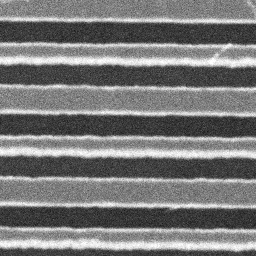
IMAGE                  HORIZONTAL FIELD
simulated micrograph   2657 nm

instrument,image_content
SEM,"lines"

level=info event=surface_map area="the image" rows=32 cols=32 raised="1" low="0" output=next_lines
11111111111111111111111111111111
11111111111111111111111111111111
00000001111111111111111111111111
00000000000000000000000000000000
00000000000000000000000000000000
11111110000000000000000000000000
11111111111111111111111111111111
11111111111111111111111111111111
00000000000000000000000000000000
00000000000000000000000000000000
00000000000000000000000000000000
11111111111111111111111111111111
11111111111111111111111111111111
11111111111111111111111111111111
00000000000000000000000000000000
00000000000000000000000000000000
00000000000000000000000000000000
11111111111111111111111111111111
11111111111111111111111111111111
00000000001100010000111111111011
00000000000000000000000000000000
00000000000000000000000000000000
11111111111111111111111111111111
11111111111111111111111111111111
11111111111111111111111111111111
11111111111111111111111111111111
00000000000000000000000000000000
00000000000000000000000000000000
10000001000000000000000000000000
11111111111111111111111111111111
11111111111111111111111111111111
00000000000000000000000000000000